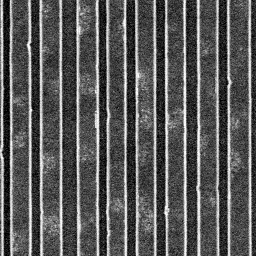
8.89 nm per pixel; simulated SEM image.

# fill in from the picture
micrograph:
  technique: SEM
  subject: parallel lines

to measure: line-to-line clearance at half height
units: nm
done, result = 88.9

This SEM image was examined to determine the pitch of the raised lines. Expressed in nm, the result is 278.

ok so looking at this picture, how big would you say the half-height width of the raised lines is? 178 nm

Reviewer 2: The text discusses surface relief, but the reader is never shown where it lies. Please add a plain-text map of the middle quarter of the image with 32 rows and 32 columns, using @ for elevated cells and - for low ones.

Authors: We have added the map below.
---@@@@@---@@@@---@@@@@---@@@@--
---@@@@@---@@@@---@@@@@---@@@@--
---@@@@@---@@@@---@@@@@---@@@@--
---@@@@@---@@@@---@@@@@---@@@@--
---@@@@@---@@@@---@@@@@---@@@@--
---@@@@@@--@@@@---@@@@@---@@@@--
---@@@@@@--@@@@---@@@@@---@@@@--
---@@@@@@--@@@@---@@@@@---@@@@--
---@@@@@---@@@@---@@@@@---@@@@--
---@@@@@---@@@@---@@@@@---@@@@--
---@@@@@---@@@@---@@@@@---@@@@--
---@@@@@@--@@@@---@@@@@---@@@@--
---@@@@@@--@@@@---@@@@@---@@@@--
---@@@@@@--@@@@---@@@@@---@@@@--
---@@@@@@--@@@@---@@@@@---@@@@--
---@@@@@@--@@@@---@@@@@---@@@@--
---@@@@@@--@@@@---@@@@@---@@@@--
---@@@@@---@@@@---@@@@@---@@@@--
---@@@@@---@@@@---@@@@@---@@@@--
---@@@@@---@@@@---@@@@@---@@@@--
---@@@@@---@@@@---@@@@@---@@@@--
---@@@@@---@@@@---@@@@@---@@@@--
---@@@@@---@@@@---@@@@@---@@@@--
---@@@@@---@@@@---@@@@@---@@@@--
---@@@@@---@@@@---@@@@@---@@@@--
---@@@@@---@@@@---@@@@@---@@@@--
---@@@@@---@@@@---@@@@@---@@@@--
---@@@@@---@@@@---@@@@@---@@@@--
---@@@@@---@@@@---@@@@@---@@@@--
---@@@@@---@@@@---@@@@@---@@@@--
---@@@@@---@@@@---@@@@@---@@@@--
---@@@@@---@@@@---@@@@@---@@@@--